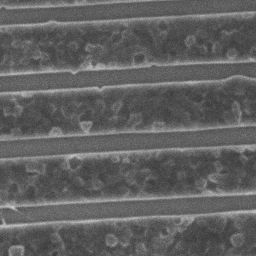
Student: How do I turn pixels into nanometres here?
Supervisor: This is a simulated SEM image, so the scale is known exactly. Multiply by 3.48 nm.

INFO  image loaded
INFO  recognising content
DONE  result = one or a few lines or trenches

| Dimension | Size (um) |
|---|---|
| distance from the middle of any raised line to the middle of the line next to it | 0.23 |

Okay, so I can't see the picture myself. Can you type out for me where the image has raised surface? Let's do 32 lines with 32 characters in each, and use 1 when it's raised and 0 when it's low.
11111111111100000000000000000000
00000000000000000000000000000011
00000000000000011111111111111111
11111111111111111111111111111111
11111111111111111111111111111111
11111111111111111111111111111111
11111111111111111111111111111111
11111111111111111111111111111111
11111111111111110000000000000000
00000000000000000000000000000100
00000000000000000100111111111111
00111111111111111111111111111111
11111111111111111111111111111111
11111111111111111111111111111111
11111111111111111111111111111111
11111111111111111111111111111111
11111111111111111111100000000000
10000000000000000000000000000000
00000000000000000000000011111111
00000001111111111111111111111111
11111111111111111111111111111111
11111111111111111111111111111111
11111111111111111111111111111111
11111111111111111111111111111111
11111111111111111111111110100000
11111111000000000000000000000000
00000000000000000000000000000111
00000000000011111111111111111111
11111111111111111111111111111111
11111111111111111111111111111111
11111111111111111111111111111111
11111111111111111111111111111111